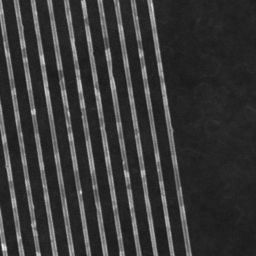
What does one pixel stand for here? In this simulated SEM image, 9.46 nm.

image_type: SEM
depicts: parallel lines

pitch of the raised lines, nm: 156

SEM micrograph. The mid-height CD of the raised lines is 36.3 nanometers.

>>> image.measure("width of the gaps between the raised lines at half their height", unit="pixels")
12.7